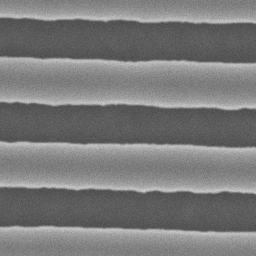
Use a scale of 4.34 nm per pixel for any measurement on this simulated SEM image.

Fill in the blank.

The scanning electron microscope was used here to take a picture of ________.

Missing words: lines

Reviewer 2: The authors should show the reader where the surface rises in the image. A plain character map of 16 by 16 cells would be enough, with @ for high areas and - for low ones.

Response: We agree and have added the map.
@@@@@@@@@@@@@@@@
----------------
----------------
----------------
@@@@@@@@@@@@@@@@
@@@@@@@@@@@@@@@@
---@@@@-@@@@@@@@
----------------
----------------
@@@@@@@@@@@@@@@@
@@@@@@@@@@@@@@@@
@@@@@@@@@@@@@@@@
----------------
----------------
@@@@@@@@@@@@@---
@@@@@@@@@@@@@@@@